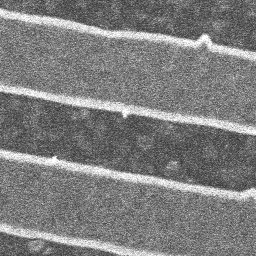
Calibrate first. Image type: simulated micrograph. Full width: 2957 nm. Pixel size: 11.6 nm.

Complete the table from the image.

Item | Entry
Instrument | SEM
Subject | one or a few lines or trenches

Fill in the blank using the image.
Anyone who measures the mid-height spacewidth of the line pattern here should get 729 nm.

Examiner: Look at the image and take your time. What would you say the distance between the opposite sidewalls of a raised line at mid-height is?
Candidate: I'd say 882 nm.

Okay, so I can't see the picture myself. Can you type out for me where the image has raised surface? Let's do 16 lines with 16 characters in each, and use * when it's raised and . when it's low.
................
*****...........
***********.....
****************
****************
****************
.....***********
............****
................
................
*****...........
***********.....
****************
****************
.***************
.......*********